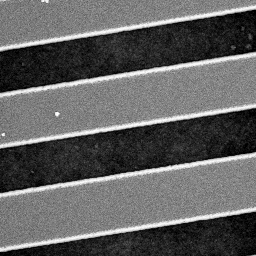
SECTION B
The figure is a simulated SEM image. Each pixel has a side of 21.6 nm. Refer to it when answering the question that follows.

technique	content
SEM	lines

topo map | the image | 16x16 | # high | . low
################
##########......
####............
...............#
........########
..##############
################
###########.....
#####...........
................
..........######
....############
################
##############..
########........
#...............